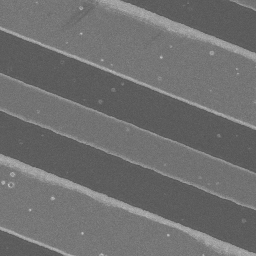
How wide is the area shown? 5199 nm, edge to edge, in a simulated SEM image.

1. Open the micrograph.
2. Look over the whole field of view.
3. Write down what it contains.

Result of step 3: lines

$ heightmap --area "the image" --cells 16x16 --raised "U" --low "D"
UUUUUUUUDDDDDDDD
UUUUUUUUUUUDDDDD
DDUUUUUUUUUUUUDD
DDDDUUUUUUUUUUUU
DDDDDDDUUUUUUUUU
UUDDDDDDDUUUUUUU
UUUUUDDDDDDDUUUU
DUUUUUUDDDDDDDUU
DDDDUUUUUUDDDDDD
DDDDDDDUUUUUUDDD
UUDDDDDDDUUUUUUD
UUUUUDDDDDDDUUUU
UUUUUUUDDDDDDDUU
UUUUUUUUUUDDDDDD
UUUUUUUUUUUUDDDD
DDDUUUUUUUUUUUUD